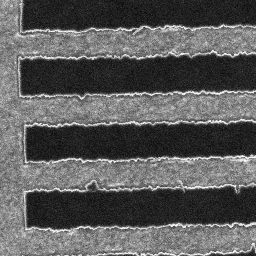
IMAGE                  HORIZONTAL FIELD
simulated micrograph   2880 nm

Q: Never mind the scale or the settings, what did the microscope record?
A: one or a few lines or trenches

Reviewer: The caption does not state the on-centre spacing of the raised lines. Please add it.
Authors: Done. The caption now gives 746 nanometres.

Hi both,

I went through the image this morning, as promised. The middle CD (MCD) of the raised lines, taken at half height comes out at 434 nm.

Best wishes